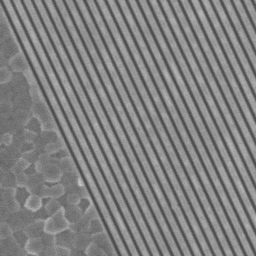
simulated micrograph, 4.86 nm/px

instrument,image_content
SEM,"parallel lines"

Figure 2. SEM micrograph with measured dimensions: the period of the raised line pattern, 46.1 nm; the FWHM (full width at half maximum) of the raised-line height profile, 29.2 nm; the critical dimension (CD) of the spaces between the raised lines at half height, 19.3 nm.